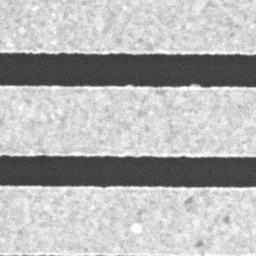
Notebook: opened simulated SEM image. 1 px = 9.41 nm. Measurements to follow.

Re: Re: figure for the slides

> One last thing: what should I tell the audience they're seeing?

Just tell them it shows lines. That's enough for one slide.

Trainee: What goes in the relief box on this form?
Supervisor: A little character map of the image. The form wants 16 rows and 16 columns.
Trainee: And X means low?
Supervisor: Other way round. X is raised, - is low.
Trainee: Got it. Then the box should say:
XXXXXXXXXXXXXXXX
XXXXXXXXXXXXXXXX
XXXXXXXXXXXXXXXX
----------------
----------------
XXXXXXXXXXXXXXX-
XXXXXXXXXXXXXXXX
XXXXXXXXXXXXXXXX
XXXXXXXXXXXXXXXX
XXXXXXXXXXXXXXXX
----------------
----------------
XXXXXXXXXXXXXXXX
XXXXXXXXXXXXXXXX
XXXXXXXXXXXXXXXX
XXXXXXXXXXXXXXXX